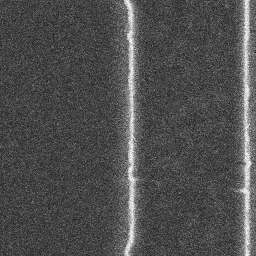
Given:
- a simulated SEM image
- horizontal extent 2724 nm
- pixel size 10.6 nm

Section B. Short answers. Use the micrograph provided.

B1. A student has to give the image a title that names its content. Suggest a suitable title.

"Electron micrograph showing one or a few lines or trenches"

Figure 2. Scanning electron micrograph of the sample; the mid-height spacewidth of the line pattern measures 1210 nm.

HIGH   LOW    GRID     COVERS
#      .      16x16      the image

########.......#
########.......#
########.......#
########.......#
########.......#
########.......#
########.......#
########.......#
########.......#
########.......#
########.......#
########.......#
########.......#
########.......#
########.......#
########.......#